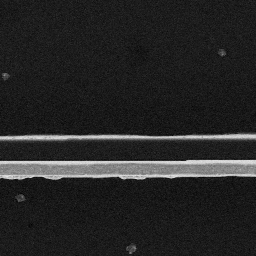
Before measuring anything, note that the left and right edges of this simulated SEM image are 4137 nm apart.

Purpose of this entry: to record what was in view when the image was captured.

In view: lines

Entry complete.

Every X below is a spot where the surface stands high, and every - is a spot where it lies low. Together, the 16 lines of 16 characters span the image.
----------------
----------------
----------------
----------------
----------------
----------------
----------------
----------------
----------------
XXXXXXXXXXXXXXXX
XXXXXXXXXXXXXXXX
----------------
----------------
----------------
----------------
----------------